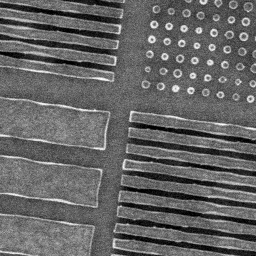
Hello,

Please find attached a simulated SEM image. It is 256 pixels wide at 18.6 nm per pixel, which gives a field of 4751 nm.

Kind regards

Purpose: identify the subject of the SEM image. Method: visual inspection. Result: groups of lines, slits or small figures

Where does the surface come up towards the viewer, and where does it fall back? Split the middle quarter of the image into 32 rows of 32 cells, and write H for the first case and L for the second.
HHHLLLLLLLLLLLLLLLLLLLLLLLLLLLLL
HHHHHHHHHLLLLLLLLLLLLHLLHHLLHLLL
HHHHHHHHHHHHLLLLLLLLLLLLLLLLHLLL
LLLLLLLLLHHHLLLLLLLLLLLLLLLLLLLL
LLLLLLLLLLLLLLLLLLLLHLLLLLLLLLLL
LLLLLLLLLLLLLLLLLLLLHLLLHLLLLLLL
LLLLLLLLLLLLLLLLLLLLLLLLLLLLLLLH
LLLLLLLLLLLLLLLLLLLLLLLLLLLLLLLL
LLLLLLLLLLLLLLLLLLLLLLLLLLLLLLLL
LLLLLLLLLLLLLLLLLLLLLLLLLLLLLLLL
LLLLLLLLLLLLLLLLLLLLLLLLLLLLLLLL
HHHHHLLLLLLLLLLLLLLLLLLLLLLLLLLL
HHHHHHHHHHHLLLLLLHHHHHLLLLLLLLLL
HHHHHHHHHHHLLLLLLHHHHHHHHHHHHLLL
HHHHHHHHHHHLLLLLLLLHHHHHHHHHHHHH
HHHHHHHHHHHLLLLLLLLLLLLLLHHHHHHH
HHHHHHHHHHHLLLLLHHHHHHLLLLLLLLLL
HHHHHHHHHHLLLLLLHHHHHHHHHHHHHLLL
HHHHHHHHHHLLLLLLLLLHHHHHHHHHHHHH
HHHHHHHHHHLLLLLLLLLLLLLLLLHHHHHH
LLLLLHHHHHLLLLLLHHHHLLLLLLLLLLLL
LLLLLLLLLLLLLLLLHHHHHHHHHHLLLLLL
LLLLLLLLLLLLLLLLLLLHHHHHHHHHHHHH
LLLLLLLLLLLLLLLLLLLLLLLLLLLHHHHH
LLLLLLLLLLLLLLLHHHHLLLLLLLLLLLLL
HHHHLLLLLLLLLLLHHHHHHHHHHHHLLLLL
HHHHHHHHHLLLLLLLLLLHHHHHHHHHHHHH
HHHHHHHHHLLLLLLLLLLLLLLLLLHHHHHH
HHHHHHHHHLLLLLLHHHHHHLLLLLLLLLLL
HHHHHHHHHLLLLLLHHHHHHHHHHHHLLLLL
HHHHHHHHHLLLLLLLHHHHHHHHHHHHHHHH
HHHHHHHHHLLLLLLLLLLLLLLLLHHHHHHH